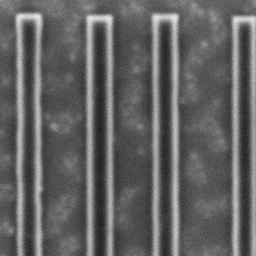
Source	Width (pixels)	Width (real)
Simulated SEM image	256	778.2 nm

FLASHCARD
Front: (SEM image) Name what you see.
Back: one or a few lines or trenches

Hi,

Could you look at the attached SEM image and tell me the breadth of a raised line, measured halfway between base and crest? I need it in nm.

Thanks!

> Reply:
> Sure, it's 64.6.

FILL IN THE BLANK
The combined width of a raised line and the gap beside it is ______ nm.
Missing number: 217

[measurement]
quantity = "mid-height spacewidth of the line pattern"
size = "151 nanometers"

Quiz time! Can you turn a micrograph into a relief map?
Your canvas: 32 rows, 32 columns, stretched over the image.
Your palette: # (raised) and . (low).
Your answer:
................................
................................
..###......###.....###........##
..###......###.....###.......###
..###......###.....###.......###
..###......###.....###.......###
..###......###.....###.......###
..###......###.....###.......###
..###......###.....###.......###
...##......###.....###.......###
..###......###.....###.......###
..###......###.....###.......###
..###......###.....###.......###
..###......###.....###.......###
...##......###.....###.......###
...##......###.....###.......###
..###......###.....###.......###
..###......###.....###.......###
..###......###.....###.......###
..###......###.....###.......###
..###......###.....###.......###
..###......###.....###.......###
..###......###.....###.......###
..###......###.....###.......###
..###......###.....###.......###
..###......###.....###.......###
..###......###.....###.......###
..###......###.....###.......###
..###......###.....###.......###
..###......###.....###.......###
..###......###.....###.......###
..###......###.....###.......###